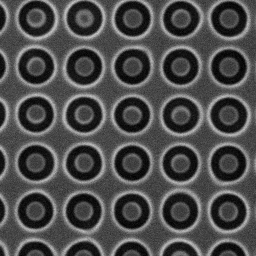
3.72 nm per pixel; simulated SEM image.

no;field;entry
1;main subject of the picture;an array of small figures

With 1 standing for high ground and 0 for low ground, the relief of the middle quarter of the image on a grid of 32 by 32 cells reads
00011110001100011110001110011110
00011110001110011110001110011110
10001110011110001100011110001100
10000000011110000000011110000000
11000000111111100000111111100000
11111011111111111111111111111111
11111111111111111111111111111111
11111111111111111111111111111111
11100001111111100001111111100001
10000000011111000000111111000000
10000100011110000000011110000000
10011110001110011110011110001110
00011110001100011110001110011110
00011110001100011110001110011110
10001100011110001100011110001110
10000000011110000000011110000000
11000000111111100000111111000000
11111111111111111111111111111011
11111111111111111111111111111111
11111111111111111111111111111111
11100001111111100001111111110001
11000000011111000000111111000000
10000000011110000000011110000000
10011110011110011110011110001110
00011110001100011110001100011110
00011110001100011110001100011110
00001100001110001100011110001110
10000000011110000000011110000000
11000000111111000000111111000000
11111111111111111111111111110001
11111111111111111111111111111111
11111111111111111111111111111111